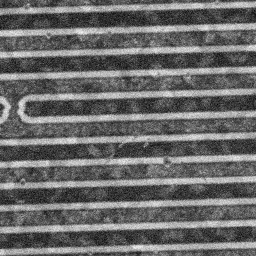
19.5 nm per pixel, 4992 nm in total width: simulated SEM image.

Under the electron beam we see parallel lines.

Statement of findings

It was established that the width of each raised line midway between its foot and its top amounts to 22.2 pixels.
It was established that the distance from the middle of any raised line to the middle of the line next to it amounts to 852 nanometers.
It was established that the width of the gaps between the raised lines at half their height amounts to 0.414 micrometres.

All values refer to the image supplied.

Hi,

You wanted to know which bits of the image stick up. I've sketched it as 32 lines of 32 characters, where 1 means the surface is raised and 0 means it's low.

11111111111111111111111111111111
00000000000000000000000000000000
00000000000000000000000000000000
00000000000000000000000001111111
11111111111111111111111111111111
11111111111111111111111111111111
11111111111111000000000000000000
00000000000000000000000000000000
00000000000000000000000000000000
00000111111111111111111111111111
11111111111111111111111111111111
11111111111111111111111111111000
11100000000000000000000000000000
01100000000000000000000000000000
01100000000000000000111111111111
11111111111111111111111111111111
11111111111111111111111111111111
11111111111110010000000000000000
00000000000000000000000000000000
00000000000000000000000000000000
00001111111111111111111111111111
11111111111111111111111111111111
11111111111111111111111111110000
00000000000000000000000000000000
00000000000000000000000000000000
00000000000000000000111111111111
11111111111111111111111111111111
11111111111111111111111111111111
11111111000000000000000000000000
00000000000000000000000000000000
00000000000000000000000000000000
11111111111111111111111111111111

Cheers